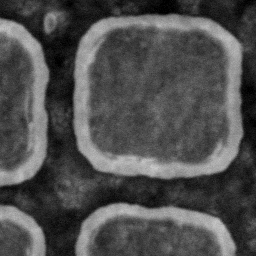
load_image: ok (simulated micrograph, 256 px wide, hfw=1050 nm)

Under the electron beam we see raised bodies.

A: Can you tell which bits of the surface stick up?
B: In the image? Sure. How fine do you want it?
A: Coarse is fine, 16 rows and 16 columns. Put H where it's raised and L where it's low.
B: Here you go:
LLLLLLLLLLLLLLLL
LLLLLLLHHHHHHLLL
HHLLLLHHHHHHHHLL
HHLLLHHHHHHHHHHL
HHHLLHHHHHHHHHHL
HHHLLHHHHHHHHHHL
HHLLLHHHHHHHHHHL
HHLLLHHHHHHHHHHL
HHHLLHHHHHHHHHHL
HHLLLLHHHHHHHHLL
HHLLLLLLLHHHHLLL
LLLLLLLLLLLLLLLL
LLLLLLLLLLLLLLLL
HLLLLLHHHHHHLLLL
HHLLLHHHHHHHHHLL
HHLLLHHHHHHHHHLL